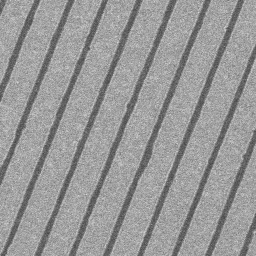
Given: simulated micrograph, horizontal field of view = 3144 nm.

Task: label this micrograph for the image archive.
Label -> parallel lines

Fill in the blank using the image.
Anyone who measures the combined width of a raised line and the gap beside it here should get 31.7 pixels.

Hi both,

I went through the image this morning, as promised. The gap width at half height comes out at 95.6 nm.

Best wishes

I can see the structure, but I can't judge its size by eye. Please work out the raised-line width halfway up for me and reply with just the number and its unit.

298 nm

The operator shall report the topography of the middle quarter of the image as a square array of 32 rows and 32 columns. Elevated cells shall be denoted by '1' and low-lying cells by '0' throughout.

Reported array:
11100111111001111111001111110011
11001111111001111110011111110011
11001111110001111110011111100011
11001111110011111100011111100111
10011111110011111100111111100111
10011111100111111100111111001111
00111111100111111001111111001111
00111111000111111001111111001111
00111111001111110001111110011111
01111111001111110011111110011111
01111110011111100011111100111111
11111110011111100011111100111111
11111100011111100111111100111111
11111100111111000111111001111111
11111100111111001111111001111110
11111001111111001111110011111110
11111001111110011111110011111100
11110001111110011111110011111100
11110011111100011111100111111100
11100011111100111111100111111001
11100111111100111111000111111001
11100111111001111111001111111011
11000111111001111111001111110011
11001111111001111110001111110011
11001111110011111110011111100111
10011111110011111110011111100111
10011111100111111100111111100111
10011111100111111100111111001111
00111111100111111001111111001111
00111111001111111001111110011111
01111111001111110001111110011111
01111110011111110011111110111111